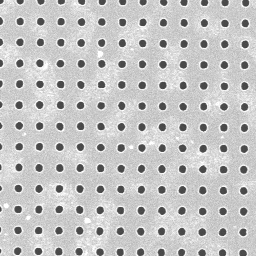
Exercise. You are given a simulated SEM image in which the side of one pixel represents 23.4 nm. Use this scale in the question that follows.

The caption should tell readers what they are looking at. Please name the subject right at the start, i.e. a regular array of holes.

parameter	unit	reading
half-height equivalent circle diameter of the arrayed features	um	0.186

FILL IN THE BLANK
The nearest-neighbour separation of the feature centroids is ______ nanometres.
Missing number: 474